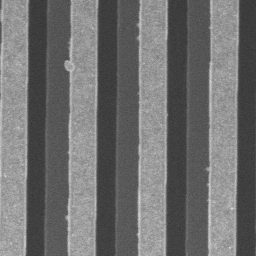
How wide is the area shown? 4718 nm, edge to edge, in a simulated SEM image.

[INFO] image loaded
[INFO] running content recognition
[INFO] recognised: lines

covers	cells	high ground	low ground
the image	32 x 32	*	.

****..******...******...******..
***...******...******...******..
***...******...******...******..
***...******...******...******..
***...******...******...******..
***...******...******...******..
***...******...******...******..
***...******...******...******..
***...******...******...******..
***...******...******...******..
***...******...******...******..
***...******...******...******..
***...******...******...******..
***...******...******...******..
***...******...******...******..
***...******...******...******..
***...******...******..*******..
***...******...******..*******..
***...******...******..*******..
***...******...******..*******..
***...******...******..*******..
***...******...******..*******..
***...******...******..*******..
***...******...******..*******..
***...******...******..*******..
***...******...******..******...
***...******...******..******...
***...******...******..******...
***...******...******..******...
***...******...******..******...
***...******...******..******...
***...******...******..******...